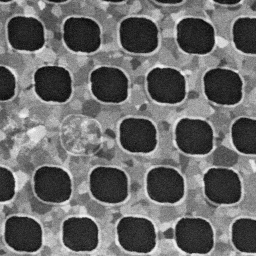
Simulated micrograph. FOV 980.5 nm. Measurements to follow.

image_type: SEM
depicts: a regular array of holes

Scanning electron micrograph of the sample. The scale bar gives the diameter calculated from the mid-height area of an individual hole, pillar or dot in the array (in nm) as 154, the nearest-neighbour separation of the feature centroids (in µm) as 0.215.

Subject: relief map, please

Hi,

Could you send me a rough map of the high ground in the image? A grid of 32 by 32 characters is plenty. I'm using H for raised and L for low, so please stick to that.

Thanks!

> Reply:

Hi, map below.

HHHHHHHHHHHHHHHHHHHHLLHHHHHLLLHH
HHHHHHHHHHHHHHHHHHHHHHHHHHHHHHHH
HLLLLHHHLLLLHHHLLLLHHHLLLLHHHHLL
HLLLLLHHLLLLLHHLLLLLHHLLLLLHHLLL
HLLLLLHHLLLLLHHLLLLLHHLLLLLHHLLL
HLLLLLHHLLLLLHHLLLLLHHLLLLLHHLLL
HHHLLHHHHLLLHHHHLLLHHHHLLLHHHHLL
HHHHHHHHHHHHHHHHHHHHHHHHHHHHHHHH
LHHHHLLLHHHHLLLHHHHLLLHHHHLLHHHH
LLHHLLLLLHHLLLLLHHLLLLLHHLLLLLHH
LLHHLLLLLHHLLLLLHHLLLLLHHLLLLLHH
LLHHLLLLLHHLLLLLHHLLLLLHHLLLLLHH
LHHHHLLLLHHHLLLLHHHLLLLHHHLLLLHH
HHHHHHHHHHHHHHHHHHHHHHHHHHHHHHHH
HHHHHHHHHHHHHHHHHHHHHHHHHHHHHHHH
HHHHHHHHHHHHHHHLLLLHHHLLLLHHHLLL
HHHHHHHHHHHHHHHLLLLLHHLLLLLHHLLL
HHHHHHHHHHHLHHHLLLLLHHLLLLLHHLLL
HHHHHHHHHLHHHHHLLLLHHHLLLLLHHLLL
HHHHHHHHHHHHHHHHHHHHHHHHLHHHHHHH
HHHHHHHHHHHHHHHHHHHHHHHHHHHHHHHH
LLHHLLLLHHHLLLLLHHHLLLHHHHLLLHHH
LLHHLLLLLHHLLLLLHHLLLLLHHLLLLLHH
LLHHLLLLLHHLLLLLHHLLLLLHHLLLLLHH
LLHHHLLLLHHHLLLLHHLLLLLHHHLLLLHH
HHHHHHHLHHHHHLHHHHHHLLHHHHHLLHHH
HHHHHHHHHHHHHHHHHHHHHHHHHHHHHHHH
HLLLLHHHLLLLHHHLLLLHHHLLLLHHHLLL
LLLLLHHHLLLLHHHLLLLHHHLLLLLHHLLL
LLLLLHHHLLLLHHHLLLLLHHLLLLLHHLLL
HLLLLHHHLLLLHHHLLLLLHHLLLLLHHLLL
HHLLHHHHHLLHHHHHLLLHHHHLLLHHHHLL